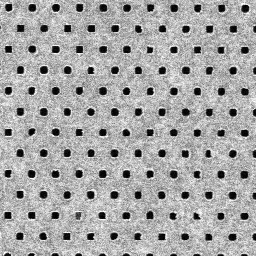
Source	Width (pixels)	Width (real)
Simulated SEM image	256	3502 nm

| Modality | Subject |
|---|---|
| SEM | a regular array of holes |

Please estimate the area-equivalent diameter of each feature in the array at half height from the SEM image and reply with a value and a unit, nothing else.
7.73 pixels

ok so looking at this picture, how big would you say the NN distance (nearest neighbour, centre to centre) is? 320 nm